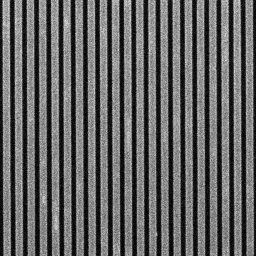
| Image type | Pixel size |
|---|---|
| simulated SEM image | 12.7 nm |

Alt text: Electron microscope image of parallel lines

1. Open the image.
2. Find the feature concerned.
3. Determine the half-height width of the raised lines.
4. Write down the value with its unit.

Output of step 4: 96.7 nm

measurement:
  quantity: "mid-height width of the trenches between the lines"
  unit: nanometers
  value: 60.2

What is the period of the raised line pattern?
154 nm